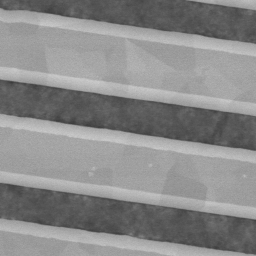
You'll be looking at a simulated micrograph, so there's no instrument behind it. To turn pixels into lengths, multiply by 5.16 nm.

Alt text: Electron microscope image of one or a few lines or trenches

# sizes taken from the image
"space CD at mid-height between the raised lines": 228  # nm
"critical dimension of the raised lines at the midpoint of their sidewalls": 0.31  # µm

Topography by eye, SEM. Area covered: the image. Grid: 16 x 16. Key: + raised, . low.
................
+++++...........
++++++++++++....
++++++++++++++++
++++++++++++++++
......++++++++++
.............+++
+...............
++++++++........
+++++++++++++++.
++++++++++++++++
..++++++++++++++
.........+++++++
................
++++............
+++++++++++.....